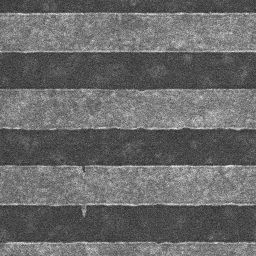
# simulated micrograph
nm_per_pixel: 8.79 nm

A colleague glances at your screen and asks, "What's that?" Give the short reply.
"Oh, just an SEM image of one or a few lines or trenches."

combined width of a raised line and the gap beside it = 671 nanometers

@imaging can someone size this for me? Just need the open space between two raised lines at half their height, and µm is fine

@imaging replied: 0.334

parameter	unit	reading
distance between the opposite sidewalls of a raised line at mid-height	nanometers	342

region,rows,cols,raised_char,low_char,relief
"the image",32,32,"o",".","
................................
................................
oooooooooooooooooooooooooooooooo
oooooooooooooooooooooooooooooooo
oooooooooooooooooooooooooooooooo
oooooooooooooooooooooooooooooooo
...oo...........................
................................
................................
................................
................................
oooooooooooooooooooooooooooooooo
oooooooooooooooooooooooooooooooo
oooooooooooooooooooooooooooooooo
oooooooooooooooooooooooooooooooo
oooooooooooooooooooooooooooooooo
................................
................................
................................
................................
................................
oooooooooooooooooooooooooooooooo
oooooooooooooooooooooooooooooooo
oooooooooooooooooooooooooooooooo
oooooooooooooooooooooooooooooooo
oooooooooooooooooooo.ooooooooooo
................................
................................
................................
................................
ooo.oooooooooooooooooooooooooooo
oooooooooooooooooooooooooooooooo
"